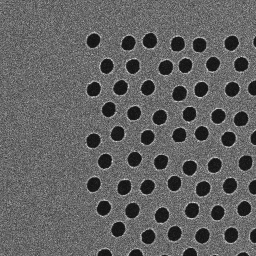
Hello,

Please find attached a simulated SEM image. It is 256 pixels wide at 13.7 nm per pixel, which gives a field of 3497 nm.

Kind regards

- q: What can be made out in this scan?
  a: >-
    a regular array of holes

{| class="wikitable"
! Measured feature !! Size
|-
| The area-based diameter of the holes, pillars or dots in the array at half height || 14.8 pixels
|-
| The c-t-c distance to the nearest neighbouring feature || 323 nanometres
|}